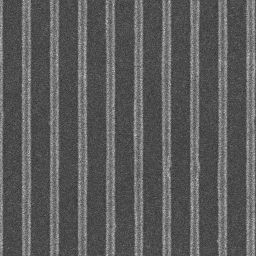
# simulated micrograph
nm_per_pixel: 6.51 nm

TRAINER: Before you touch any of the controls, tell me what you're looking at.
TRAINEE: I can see parallel lines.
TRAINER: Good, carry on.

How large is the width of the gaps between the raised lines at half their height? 133 nm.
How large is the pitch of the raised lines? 182 nm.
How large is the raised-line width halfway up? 48.8 nm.